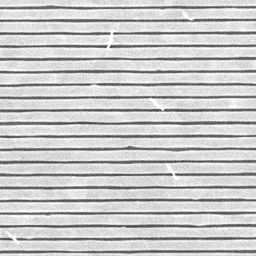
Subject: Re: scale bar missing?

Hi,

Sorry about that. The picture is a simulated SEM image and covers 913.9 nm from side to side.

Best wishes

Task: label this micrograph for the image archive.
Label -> parallel lines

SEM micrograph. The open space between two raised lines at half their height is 12.5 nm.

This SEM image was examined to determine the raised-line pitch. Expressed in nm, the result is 45.8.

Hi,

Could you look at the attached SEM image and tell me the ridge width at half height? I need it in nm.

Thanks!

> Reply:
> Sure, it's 34.8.